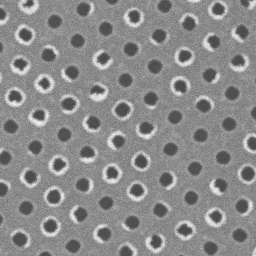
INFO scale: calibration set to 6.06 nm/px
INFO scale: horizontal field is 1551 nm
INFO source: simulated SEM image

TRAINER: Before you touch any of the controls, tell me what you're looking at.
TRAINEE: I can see a regular array of holes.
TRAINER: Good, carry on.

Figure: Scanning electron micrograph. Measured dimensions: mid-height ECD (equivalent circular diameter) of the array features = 84.6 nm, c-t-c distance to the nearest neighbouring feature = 180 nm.